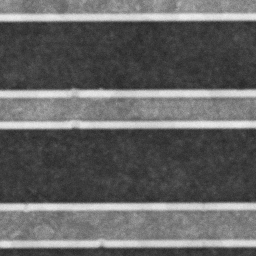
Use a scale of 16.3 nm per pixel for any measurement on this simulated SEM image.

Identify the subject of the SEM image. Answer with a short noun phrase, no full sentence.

one or a few lines or trenches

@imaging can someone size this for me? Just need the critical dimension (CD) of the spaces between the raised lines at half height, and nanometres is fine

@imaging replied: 1290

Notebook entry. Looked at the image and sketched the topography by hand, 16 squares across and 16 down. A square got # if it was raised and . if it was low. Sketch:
################
................
................
................
................
................
################
################
................
................
................
................
................
################
################
................